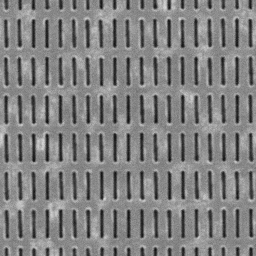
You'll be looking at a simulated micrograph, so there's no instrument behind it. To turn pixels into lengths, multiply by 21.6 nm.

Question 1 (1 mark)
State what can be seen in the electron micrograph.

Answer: a regular array of holes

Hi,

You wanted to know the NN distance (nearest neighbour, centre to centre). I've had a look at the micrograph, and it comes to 288 nm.